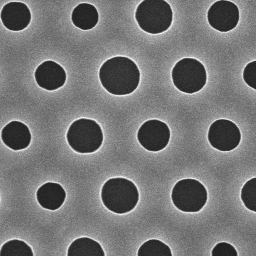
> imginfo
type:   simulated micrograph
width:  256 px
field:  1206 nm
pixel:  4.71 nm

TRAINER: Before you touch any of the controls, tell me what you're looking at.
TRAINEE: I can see a regular array of holes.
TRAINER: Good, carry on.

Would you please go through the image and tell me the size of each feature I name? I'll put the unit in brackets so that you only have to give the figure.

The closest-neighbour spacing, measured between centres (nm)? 324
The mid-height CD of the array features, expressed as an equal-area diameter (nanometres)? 153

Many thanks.